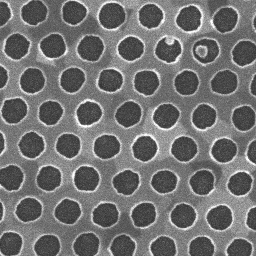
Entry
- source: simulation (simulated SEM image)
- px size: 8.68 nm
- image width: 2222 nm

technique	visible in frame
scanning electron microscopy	a regular array of holes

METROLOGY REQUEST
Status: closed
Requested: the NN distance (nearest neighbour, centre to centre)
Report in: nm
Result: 320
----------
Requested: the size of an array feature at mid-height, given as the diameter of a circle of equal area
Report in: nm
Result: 220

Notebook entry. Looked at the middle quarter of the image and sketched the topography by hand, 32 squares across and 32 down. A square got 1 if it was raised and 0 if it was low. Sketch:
11111111111111111111111111111111
00001111110001111111111111111101
00000111100000111100000111111000
00000111100000011100000011110000
00000111000000011000000011110000
00000111100000111000000011110000
00001111110000111100000111110000
11111111111111111111001111111000
11111111111111111111111111111111
11111001111111100011111111111111
11110000011111000001111100001111
11100000011110000000111000000111
11100000001110000000110000000111
11100000011110000001110000000111
11110000111110000001110000001111
11111011111111000111111100011111
11111111111111111111111111111111
00111111110111111111111111111111
00001111000001111100001111110000
00001110000000111100000111100000
00001110000000111000000111100000
00001110000000111000000111100000
00001111000001111000000111100000
00111111100011111100001111110000
11111111111111111111111111111101
11111011111111111111111111111111
11100000111111100111111110111111
11100000011110000011111000001111
11000000011100000001110000001110
11100000011100000001110000001110
11100000111100000001110000001111
11110000111110000011111000001111